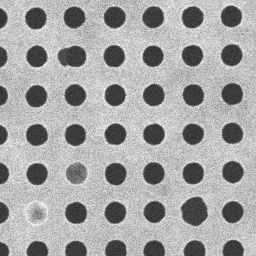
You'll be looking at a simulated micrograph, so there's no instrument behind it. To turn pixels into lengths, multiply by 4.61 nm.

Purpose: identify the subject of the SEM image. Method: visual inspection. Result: a regular array of holes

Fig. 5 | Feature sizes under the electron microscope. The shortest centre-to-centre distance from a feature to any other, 178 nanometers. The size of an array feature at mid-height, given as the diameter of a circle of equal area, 99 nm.